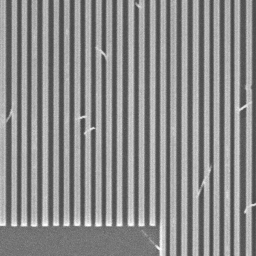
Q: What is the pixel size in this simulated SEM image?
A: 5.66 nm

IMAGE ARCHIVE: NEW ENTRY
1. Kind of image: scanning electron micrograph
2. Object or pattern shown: parallel lines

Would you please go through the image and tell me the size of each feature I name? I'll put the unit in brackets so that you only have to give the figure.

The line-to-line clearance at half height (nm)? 31.8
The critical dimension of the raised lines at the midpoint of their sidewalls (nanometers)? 31.1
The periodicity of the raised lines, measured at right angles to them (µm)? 0.0604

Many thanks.